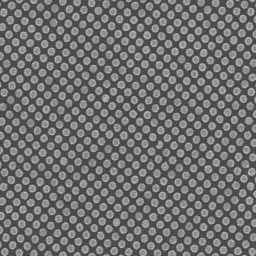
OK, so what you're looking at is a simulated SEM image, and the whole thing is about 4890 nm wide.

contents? a regular array of raised bodies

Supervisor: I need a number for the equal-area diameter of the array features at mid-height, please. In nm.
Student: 141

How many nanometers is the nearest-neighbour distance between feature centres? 191